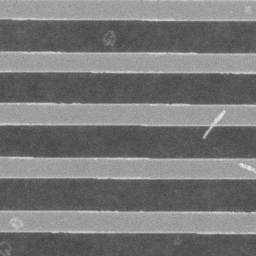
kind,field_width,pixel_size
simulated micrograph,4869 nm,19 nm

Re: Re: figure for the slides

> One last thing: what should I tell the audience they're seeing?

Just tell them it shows lines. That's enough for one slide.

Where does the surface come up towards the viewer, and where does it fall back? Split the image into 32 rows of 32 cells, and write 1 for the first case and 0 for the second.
11111111111111111111111111111111
11111111111111111111111111111111
00000000000000000111111111111111
00000000000000000000000000000000
00000000000000000000000000000000
00000000000000000000000000000000
00000000000000000000000000000000
11111111111111111111111111111111
11111111111111111111111111111111
00000000000000000000000000000000
00000000000000000000000000000000
00000000000000000000000000000000
00000000000000000000000000000000
11111111111111111111111111111111
11111111111111111111111111111111
11111111111111111111111111111111
00000000000000000000000000000000
00000000000000000000000000000000
00000000000000000000000000000000
00000000000000000000000000000000
11111111111111111111111111111111
11111111111111111111111111111111
00000000000000000000000000000000
00000000000000000000000000000000
00000000000000000000000000000000
00000000000000000000000000000000
11111111111111100000000000000000
11111111111111111111111111111111
11111111111111111111111111111111
00000000000000000000000000000000
00000000000000000000000000000000
00000000000000000000000000000000